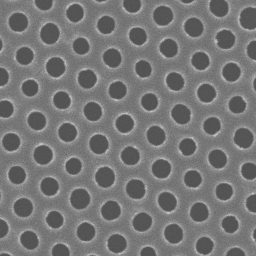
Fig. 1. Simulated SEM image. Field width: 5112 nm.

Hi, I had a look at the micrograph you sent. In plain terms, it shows a regular array of holes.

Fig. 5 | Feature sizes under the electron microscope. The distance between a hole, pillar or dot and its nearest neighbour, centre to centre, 652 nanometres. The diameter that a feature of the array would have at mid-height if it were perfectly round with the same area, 377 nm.